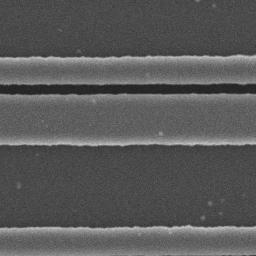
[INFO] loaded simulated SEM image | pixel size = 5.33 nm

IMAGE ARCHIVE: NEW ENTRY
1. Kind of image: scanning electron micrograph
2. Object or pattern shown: lines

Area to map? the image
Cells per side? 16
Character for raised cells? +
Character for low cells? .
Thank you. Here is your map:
................
................
................
................
++++++++++++++++
++++++++++++++++
++++++++++++++++
++++++++++++++++
++++++++++++++++
................
................
................
................
................
++++++++++++++++
++++++++++++++++